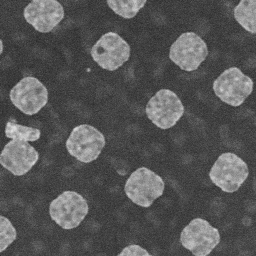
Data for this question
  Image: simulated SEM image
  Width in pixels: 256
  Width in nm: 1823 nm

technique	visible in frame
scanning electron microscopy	a regular array of raised bodies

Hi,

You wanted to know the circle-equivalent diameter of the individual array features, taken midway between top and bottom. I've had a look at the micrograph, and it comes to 0.257 µm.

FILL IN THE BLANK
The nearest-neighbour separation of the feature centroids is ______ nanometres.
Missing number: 490